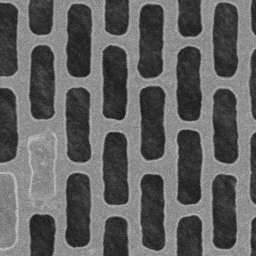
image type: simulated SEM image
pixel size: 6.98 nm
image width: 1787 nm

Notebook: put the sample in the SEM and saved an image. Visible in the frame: a regular array of holes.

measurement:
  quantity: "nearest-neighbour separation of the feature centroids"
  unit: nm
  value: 383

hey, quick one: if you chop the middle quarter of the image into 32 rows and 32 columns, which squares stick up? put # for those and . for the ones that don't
#......##.......##.......###....
#......##.......##.......###....
#.....####......###.....####....
###..#####......####...#####....
##########......############....
##########......#####...####....
#.....####......###......###....
#.....####......###......###....
.......###......###......###....
.......###......###......###....
.......###......###......###....
......####......###......###....
......####.....####......###....
......####.....####......####...
......#############......######.
......#############......#######
.......############......####...
#.....#####....####......###....
#.....####......###......###....
#.....####......###......###....
#......###......###......####...
#......###......###......####...
#......###......###......####...
#......###......####....#####...
###...####......############....
##########......############....
##########......############....
##...#####......#####.######....
#.....####......###......###....
#......###......###......###....
#......###......###......###....
.......###......###......###....